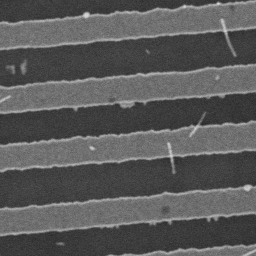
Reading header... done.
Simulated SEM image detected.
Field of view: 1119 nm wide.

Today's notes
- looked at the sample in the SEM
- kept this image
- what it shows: lines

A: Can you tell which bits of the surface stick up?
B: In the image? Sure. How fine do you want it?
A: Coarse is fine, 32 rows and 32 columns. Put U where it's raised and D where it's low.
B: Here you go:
DDDDDDDDDDDDDDDDDDDDDDDDDDDUUUUU
DDDDDDDDDDDDDDDUUDUUUUUUUUUUUUUU
DDDDDUUUUUUUUUUUUUUUUUUUUUUUUUUU
UUUUUUUUUUUUUUUUUUUUUUUUUUUUUUUU
UUUUUUUUUUUUUUUUUUUUDDDDDDDDDDDD
UUUUUUUUUUDDDDDDDDDDDDDDDDDDDDDD
DDDDDDDDDDDDDDDDDDDDDDDDDDDDDDDD
DDDDDDDDDDDDDDDDDDDDDDDDDDDDDDDD
DDDDDDDDDDDDDDDDDDDDDDDDDDUDUUUU
DDDDDDDDDDDDDDDUUUUUUUUUUUUUUUUU
DDDDUUUUUUUUUUUUUUUUUUUUUUUUUUUU
UUUUUUUUUUUUUUUUUUUUUUUUUUUUUUUU
UUUUUUUUUUUUUUUUUUUUDDDDDDDDDDDD
UUUUUUUUDDDDDDDDDDDDDDDDDDDDDDDD
DDDDDDDDDDDDDDDDDDDDDDDDDDDDDDDD
DDDDDDDDDDDDDDDDDDDDDDDDDDDDUUUU
DDDDDDDDDDDDDDDDDDUUUUUUUUUUUUUU
DDDDDDUUUUUUUUUUUUUUUUUUUUUUUUUU
UUUUUUUUUUUUUUUUUUUUUUUUUUUUUUUU
UUUUUUUUUUUUUUUUUUUUUUUDDDDDDDDD
UUUUUUUUUUDDDDDDDDDDDDDDDDDDDDDD
DDDDDDDDDDDDDDDDDDDDDDDDDDDDDDDD
DDDDDDDDDDDDDDDDDDDDDDDDDDDDDDDD
DDDDDDDDDDDDDDDDDDDDDDDDDDDDDUUU
DDDDDDDDDDDDDDDDDDDUUUUUUUUUUUUU
DDDDDDUUUUUUUUUUUUUUUUUUUUUUUUUU
UUUUUUUUUUUUUUUUUUUUUUUUUUUUUUUU
UUUUUUUUUUUUUUUUUUUUUUDDDDDDDDDD
UUUUUUUUUUUDDDDDDDDDDDDDDDDDDDDD
DDDDDDDDDDDDDDDDDDDDDDDDDDDDDDDD
DDDDDDDDDDDDDDDDDDDDDDDDDDDDDDDD
DDDDDDDDDDDDDDDDDDDUUUUUUUUUUUUU